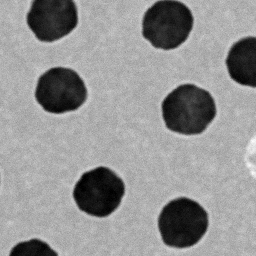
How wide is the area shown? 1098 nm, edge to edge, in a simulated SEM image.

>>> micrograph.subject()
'holes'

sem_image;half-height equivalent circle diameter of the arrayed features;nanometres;215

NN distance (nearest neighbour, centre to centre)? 0.424 micrometres